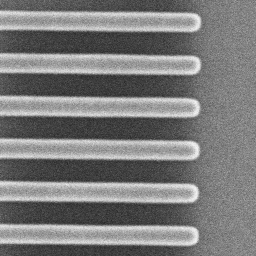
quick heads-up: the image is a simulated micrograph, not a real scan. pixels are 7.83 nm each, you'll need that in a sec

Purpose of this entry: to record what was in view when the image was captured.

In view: groups of lines, slits or small figures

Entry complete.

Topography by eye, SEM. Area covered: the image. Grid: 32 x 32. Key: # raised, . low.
................................
###.............................
#########################.......
#########################.......
................................
................................
................................
#########################.......
#########################.......
................................
................................
................................
########################........
#########################.......
............#...########........
................................
................................
##..............................
#########################.......
#########################.......
................................
................................
................................
########################........
#########################.......
................................
................................
................................
########################........
#########################.......
....................####........
................................